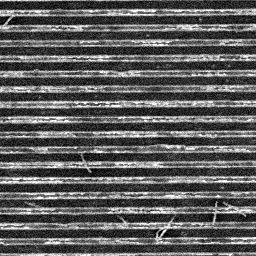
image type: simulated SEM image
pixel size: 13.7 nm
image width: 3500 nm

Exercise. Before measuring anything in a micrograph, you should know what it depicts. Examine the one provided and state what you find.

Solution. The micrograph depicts parallel lines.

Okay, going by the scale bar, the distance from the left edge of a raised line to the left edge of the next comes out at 15.2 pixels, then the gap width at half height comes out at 0.135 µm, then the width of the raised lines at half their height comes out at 82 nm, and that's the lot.